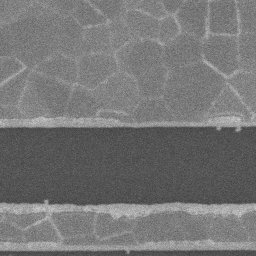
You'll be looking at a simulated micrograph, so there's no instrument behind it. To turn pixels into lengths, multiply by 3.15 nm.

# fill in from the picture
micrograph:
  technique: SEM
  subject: one or a few lines or trenches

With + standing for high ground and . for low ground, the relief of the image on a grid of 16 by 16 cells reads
++++++++++++++++
++++++++++++++++
++++++++++++++++
++++++++++++++++
++++++++++++++++
++++++++++++++++
++++++++++++++++
++++++++++++++++
................
................
................
................
................
++++++++++++++++
++++++++++++++++
+++++...........